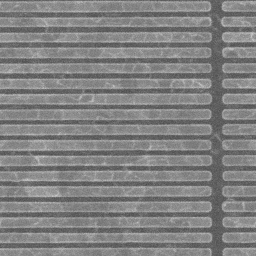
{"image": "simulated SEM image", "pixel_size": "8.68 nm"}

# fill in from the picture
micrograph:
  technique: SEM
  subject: parallel lines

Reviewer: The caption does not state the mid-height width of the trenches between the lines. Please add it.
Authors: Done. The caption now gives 6.13 pixels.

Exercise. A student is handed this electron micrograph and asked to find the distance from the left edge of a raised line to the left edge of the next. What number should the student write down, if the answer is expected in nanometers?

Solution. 134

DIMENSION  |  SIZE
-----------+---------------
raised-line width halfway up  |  81.4 nm